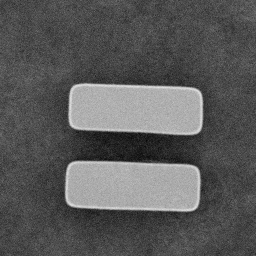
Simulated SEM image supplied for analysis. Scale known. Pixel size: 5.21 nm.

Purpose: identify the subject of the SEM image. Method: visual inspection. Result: groups of lines, slits or small figures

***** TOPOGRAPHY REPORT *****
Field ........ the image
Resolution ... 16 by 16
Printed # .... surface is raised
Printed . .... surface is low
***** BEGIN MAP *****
................
................
................
................
................
.....#######....
....#########...
....#########...
................
................
....########....
....########....
....########....
................
................
................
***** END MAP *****